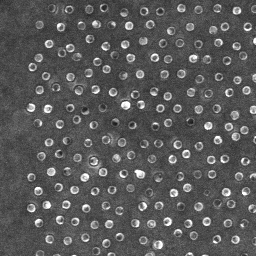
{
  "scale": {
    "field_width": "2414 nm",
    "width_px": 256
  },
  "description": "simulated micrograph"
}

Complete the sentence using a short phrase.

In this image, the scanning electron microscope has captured a regular array of raised bodies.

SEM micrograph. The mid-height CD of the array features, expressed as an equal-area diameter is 75.3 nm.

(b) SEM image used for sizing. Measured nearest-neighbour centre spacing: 11.1 px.